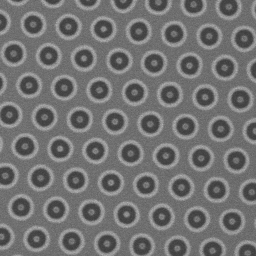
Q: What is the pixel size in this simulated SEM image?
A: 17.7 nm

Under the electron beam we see an array of small figures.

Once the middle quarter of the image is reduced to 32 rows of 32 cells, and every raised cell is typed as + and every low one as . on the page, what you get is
+++....++++.....++++.....++++..+
++++++++++++...+++++.....++++...
++++++++++++++++++++++.+++++++..
.+++++++++++++++++++++++++++++++
..+++++....++++++.++++++++++++++
...+++.....++++.....+++++...++++
...+++..+..++++.....++++.....+++
..++++.....++++.....++++..+..+++
.++++++....++++.....++++.....+++
++++++++++++++++...++++++...++++
++++++++++++++++++++++++++++++++
+++..+++++++++++++++++++++++++++
++....+++++....++++++..+++++++++
+......+++.....++++.....+++++...
+.....++++..+...+++.....++++....
++....++++.....++++..+..++++..+.
+++.+++++++...+++++.....++++....
++++++++++++++++++++...+++++....
++++++++++++++++++++++++++++++++
.++++++...++++++.+++++++++++++++
..+++.....+++++....++++++.++++++
..+++......+++.....++++.....++++
.++++.....++++..+..++++.....++++
.+++++....++++.....++++.....++++
+++++++++++++++...+++++.....++++
+++++++++++++++++++++++++..+++++
++..++++++++++++++++++++++++++++
+....+++++...+++++++++++++++++++
......+++.....+++++....+++++..++
+.....+++..+...+++.....++++....+
+....++++.....++++..+..++++..+..
++..++++++....++++.....++++.....